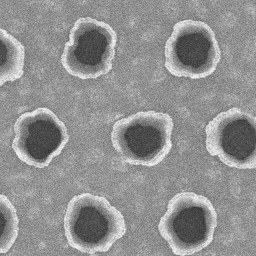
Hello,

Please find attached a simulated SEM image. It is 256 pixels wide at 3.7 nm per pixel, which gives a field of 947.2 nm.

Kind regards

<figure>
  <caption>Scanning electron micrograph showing holes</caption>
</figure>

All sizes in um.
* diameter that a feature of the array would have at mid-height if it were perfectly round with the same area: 0.156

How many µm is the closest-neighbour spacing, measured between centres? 0.369